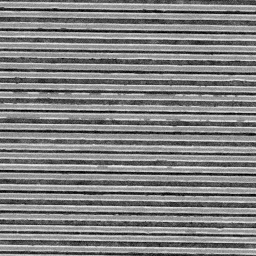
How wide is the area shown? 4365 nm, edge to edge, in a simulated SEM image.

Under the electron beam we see parallel lines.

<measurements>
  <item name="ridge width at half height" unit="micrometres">0.0788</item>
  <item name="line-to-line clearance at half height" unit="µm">0.0788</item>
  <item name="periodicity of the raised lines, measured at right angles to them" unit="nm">173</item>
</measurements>